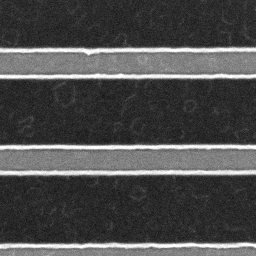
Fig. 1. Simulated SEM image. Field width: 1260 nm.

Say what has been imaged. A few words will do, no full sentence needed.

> one or a few lines or trenches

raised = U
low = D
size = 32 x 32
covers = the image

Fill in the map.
UUUUUUUUUUUUUUUUUUUUUUUUUUUUUUUU
UUUUUUUUUUUUUUUUUUUUUUUUUUUUUUUU
UUUUUUUUUUUUUUUUUUUUUUUUUUUUUUUU
UUUUUUUUUUUUUUUUUUUUUUUUUUUUUUUU
UUUUUUUUUUUUUUUUUUUUUUUUUUUUUUUU
UUUUUUUUUUUUUUUUUUUUUUUUUUUUUUUU
DDDDDDDDDDDUDDDDDDDDDDDDDDDDDDDD
DDDDDDDDDDDDDDDDDDDDDDDDDDDDDDDD
DDDDDDDDDDDDDDDDDDDDDDDDDDDDDDDD
DDDDDDDUDUUUUDUUDDUDUDDDDDDUUDDU
UUUUUUUUUUUUUUUUUUUUUUUUUUUUUUUU
UUUUUUUUUUUUUUUUUUUUUUUUUUUUUUUU
UUUUUUUUUUUUUUUUUUUUUUUUUUUUUUUU
UUUUUUUUUUUUUUUUUUUUUUUUUUUUUUUU
UUUUUUUUUUUUUUUUUUUUUUUUUUUUUUUU
UUUUUUUUUUUUUUUUUUUUUUUUUUUUUUUU
UUUUUUUUUUUUUUUUUUUUUUUUUUUUUUUU
UUUUUUUUUUUUUUUUUUUUUUUUUUUUUUUU
DDDDDDDDDDDDDDDDDDDDDDDDDDDDDDDD
DDDDDDDDDDDDDDDDDDDDDDDDDDDDDDDD
DDDDDDDDDDDDDDDDDDDDDDDDDDDDDDDD
DDDDDDDDDDDDDDDDDDDDDDDDDDDDDDDU
UUUUUUUUUUUUUUUUUUUUUUUUUUUUUUUU
UUUUUUUUUUUUUUUUUUUUUUUUUUUUUUUU
UUUUUUUUUUUUUUUUUUUUUUUUUUUUUUUU
UUUUUUUUUUUUUUUUUUUUUUUUUUUUUUUU
UUUUUUUUUUUUUUUUUUUUUUUUUUUUUUUU
UUUUUUUUUUUUUUUUUUUUUUUUUUUUUUUU
UUUUUUUUUUUUUUUUUUUUUUUUUUUUUUUU
UUUUUUUUUUUUUUUUUUUUUUUUUUUUUUUU
UUUUUUUUUUUUUUUUUUUUUUUUUUUUUUUU
DDDDDDDDDDDDDDDDDDDDDDDDDDDDDDDD